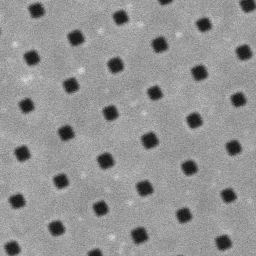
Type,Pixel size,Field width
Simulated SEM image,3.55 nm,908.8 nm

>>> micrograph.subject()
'a regular array of holes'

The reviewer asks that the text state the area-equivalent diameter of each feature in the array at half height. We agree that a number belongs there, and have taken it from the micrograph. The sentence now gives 61.7 nanometers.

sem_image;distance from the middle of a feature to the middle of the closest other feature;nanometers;169